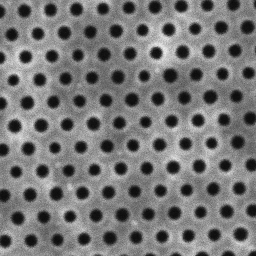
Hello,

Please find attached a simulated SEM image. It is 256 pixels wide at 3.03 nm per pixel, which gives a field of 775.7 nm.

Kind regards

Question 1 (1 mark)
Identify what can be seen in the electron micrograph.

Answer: a regular array of holes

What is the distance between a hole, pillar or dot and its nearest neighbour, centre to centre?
0.0786 um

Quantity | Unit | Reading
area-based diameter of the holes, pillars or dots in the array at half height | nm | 37.5